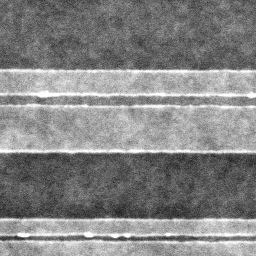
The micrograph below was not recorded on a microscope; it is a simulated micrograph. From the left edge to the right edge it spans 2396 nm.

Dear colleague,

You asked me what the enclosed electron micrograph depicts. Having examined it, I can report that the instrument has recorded lines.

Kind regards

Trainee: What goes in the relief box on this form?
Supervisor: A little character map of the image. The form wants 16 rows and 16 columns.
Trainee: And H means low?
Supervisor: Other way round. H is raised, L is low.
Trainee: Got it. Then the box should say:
LLLLLLLLLLLLLLLL
LLLLLLLLLLLLLLLL
LLLLLLLLLLLLLLLL
LLLLLLLLLLLLLLLL
HHHHHHHHHHHHHHHH
HHHHHHHHHHHHHHHH
HHHHHHHHHHHHHHHH
HHHHHHHHHHHHHHHH
HHHHHHHHHHHHHHHH
LLLLLLLLLLLLLLLL
LLLLLLLLLLLLLLLL
LLLLLLLLLLLLLLLL
LLLLLLLLLLLLLLLL
LLLLLLLLLLLLLLLL
HHHHHHHHHHHHHHHH
HHHHHHHHHHHHHHHH